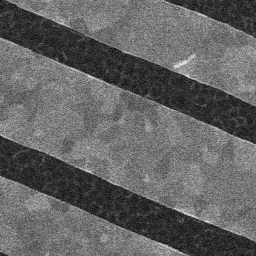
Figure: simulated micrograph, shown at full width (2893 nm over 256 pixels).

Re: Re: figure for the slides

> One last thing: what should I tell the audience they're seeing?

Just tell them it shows one or a few lines or trenches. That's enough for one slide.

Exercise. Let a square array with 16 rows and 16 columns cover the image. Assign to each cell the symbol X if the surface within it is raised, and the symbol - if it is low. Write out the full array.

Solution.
-XXXXXXXXXX-----
----XXXXXXXXXX--
------XXXXXXXXXX
XXX------XXXXXXX
XXXXX------XXXXX
XXXXXXX-------XX
XXXXXXXXXX-X----
XXXXXXXXXXXX----
XXXXXXXXXXXXXXX-
---XXXXXXXXXXXXX
-----XXXXXXXXXXX
X------XXXXXXXXX
XXXX------XXXXXX
XXXXXX------XXXX
XXXXXXXX-------X
XXXXXXXXXXX-----